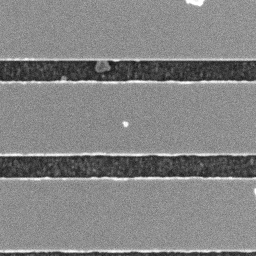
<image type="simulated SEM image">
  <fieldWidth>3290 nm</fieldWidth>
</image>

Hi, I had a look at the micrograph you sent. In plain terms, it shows lines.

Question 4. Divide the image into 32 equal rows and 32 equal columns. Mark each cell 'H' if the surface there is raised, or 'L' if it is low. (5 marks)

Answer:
HHHHHHHHHHHHHHHHHHHHHHHHHHHHHHHH
HHHHHHHHHHHHHHHHHHHHHHHHHHHHHHHH
HHHHHHHHHHHHHHHHHHHHHHHHHHHHHHHH
HHHHHHHHHHHHHHHHHHHHHHHHHHHHHHHH
HHHHHHHHHHHHHHHHHHHHHHHHHHHHHHHH
HHHHHHHHHHHHHHHHHHHHHHHHHHHHHHHH
HHHHHHHHHHHHHHHHHHHHHHHHHHHHHHHH
LLLLLLLLLLLLLLHLLHLLLLLLLLLLLLLL
LLLLLLLLLLLLLLLLLLLLLLLLLLLLLLLL
LLLLLLLLLLLLLLLLLLLLLLLLLLLLLLLL
HHHHHHHHHHHHHHHHHHHHHHHHHHHHHHHH
HHHHHHHHHHHHHHHHHHHHHHHHHHHHHHHH
HHHHHHHHHHHHHHHHHHHHHHHHHHHHHHHH
HHHHHHHHHHHHHHHHHHHHHHHHHHHHHHHH
HHHHHHHHHHHHHHHHHHHHHHHHHHHHHHHH
HHHHHHHHHHHHHHHHHHHHHHHHHHHHHHHH
HHHHHHHHHHHHHHHHHHHHHHHHHHHHHHHH
HHHHHHHHHHHHHHHHHHHHHHHHHHHHHHHH
HHHHHHHHHHHHHHHHHHHHHHHHHHHHHHHH
LLLLLLLLLLLLLLLLLLLLLLLLLLLLLLLL
LLLLLLLLLLLLLLLLLLLLLLLLLLLLLLLL
LLLLLLLLLLLLLLLLLLLLLLLLLLLLLLLL
HHHHHHHHHHHHHHHHHHHHHHHHHHHHHHHH
HHHHHHHHHHHHHHHHHHHHHHHHHHHHHHHH
HHHHHHHHHHHHHHHHHHHHHHHHHHHHHHHH
HHHHHHHHHHHHHHHHHHHHHHHHHHHHHHHH
HHHHHHHHHHHHHHHHHHHHHHHHHHHHHHHH
HHHHHHHHHHHHHHHHHHHHHHHHHHHHHHHH
HHHHHHHHHHHHHHHHHHHHHHHHHHHHHHHH
HHHHHHHHHHHHHHHHHHHHHHHHHHHHHHHH
HHHHHHHHHHHHHHHHHHHHHHHHHHHHHHHH
LLLLLLLLLLLLLLLLLLLLLLLLLLLLLLLL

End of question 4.